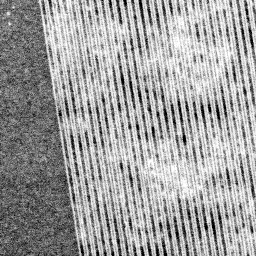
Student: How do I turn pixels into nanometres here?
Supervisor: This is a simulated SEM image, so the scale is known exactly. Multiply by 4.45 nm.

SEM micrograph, parallel lines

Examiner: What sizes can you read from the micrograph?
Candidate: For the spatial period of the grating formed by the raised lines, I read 33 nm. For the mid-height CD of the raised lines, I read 14.8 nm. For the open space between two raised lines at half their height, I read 18.7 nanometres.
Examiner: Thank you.